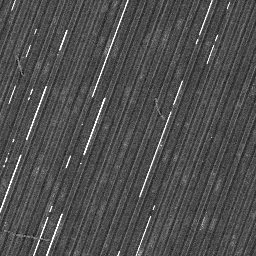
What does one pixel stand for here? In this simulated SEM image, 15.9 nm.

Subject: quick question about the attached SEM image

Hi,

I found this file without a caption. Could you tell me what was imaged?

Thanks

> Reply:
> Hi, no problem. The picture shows parallel lines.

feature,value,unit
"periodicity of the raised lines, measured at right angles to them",0.134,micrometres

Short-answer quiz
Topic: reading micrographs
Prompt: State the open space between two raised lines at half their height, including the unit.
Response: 0.0636 micrometres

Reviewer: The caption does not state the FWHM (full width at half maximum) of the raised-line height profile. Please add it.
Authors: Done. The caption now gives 4.8 px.